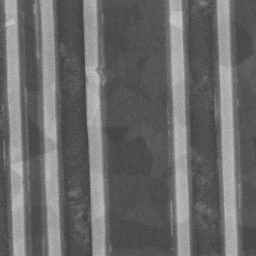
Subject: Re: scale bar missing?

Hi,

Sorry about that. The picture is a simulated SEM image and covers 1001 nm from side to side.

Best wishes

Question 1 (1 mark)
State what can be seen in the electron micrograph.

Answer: one or a few lines or trenches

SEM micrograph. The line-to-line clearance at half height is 0.179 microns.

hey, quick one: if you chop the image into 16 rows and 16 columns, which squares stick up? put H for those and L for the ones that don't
LHHLLLHHHHHLLLHH
LHHLLLHHHHHLLLHH
LHHLLLHHHHHLLLHH
LHHLLLHHHHHLLLHH
LHHLLLHHHHHLLLHH
LHHLLLHHHHHLLLHH
LHHLLLHHHHHLLLHH
LHHLLLHHHHHLLLHH
LHHLLLHHHHHLLLHH
LHHLLLHHHHHLLLHH
LHHLLLHHHHHLLLHH
LHHLLLHHHHHLLLHH
LHHLLLHHHHHLLLHH
LHHLLLHHHHHLLLHH
LHHLLLHHHHHLLLHH
LHHLLLHHHHHHLLHH